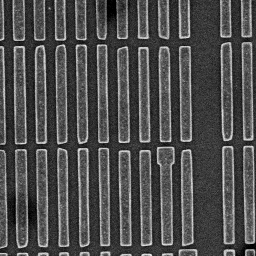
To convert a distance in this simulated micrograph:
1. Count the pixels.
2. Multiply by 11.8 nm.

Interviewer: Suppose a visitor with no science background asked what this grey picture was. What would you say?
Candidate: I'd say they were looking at wiring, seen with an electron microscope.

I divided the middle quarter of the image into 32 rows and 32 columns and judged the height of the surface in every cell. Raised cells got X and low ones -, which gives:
---XX----XX---XX---XX---XX---XX-
---XX----XX---XX---XX---XX---XX-
---XXX---XX---XX---XX---XX---XX-
---XXX---XX---XX---XX---XX---XX-
---XXX---XX---XX---XX---XX---XX-
---XXX---XX---XX---XX---XX---XX-
---XXX---XX---XX---XX---XX---XX-
---XXX---XX---XX---XX---XX---XX-
----XX---XX---XX---XX---XX---XX-
----XX---XX---XX---XX---XX---XXX
----XX---XX---XX---XX---XX---XXX
----XX---XX---XX---XX---XX---XXX
----XX---XX---XX---XX---XX---XXX
----XX---XX---XX---XX---XX---XXX
----XX---XX---XX---XX---XX---XXX
----XX---XX---XX---XX---XX---XXX
----XX---XX---XX---XX---XX---XXX
X---XX---XX---XX---XX---XX---XXX
X---XX---XX---XX---XX---XX---XXX
----X---------------------------
--------------------------------
----XX---XX-------------XXX-----
X---XX---XX---XX---XX---XXX---XX
X---XX---XX---XX---XX---XXX---XX
X---XX---XX---XX---XXX--XXX---XX
X---XX---XX---XX---XXX--XXX---XX
X---XX---XX---XX---XXX--XXX---XX
X---XX---XX---XX---XXX--XXX---XX
X---XX---XX---XX---XXX--XXX---XX
X---XX---XX---XX---XXX--XXX---XX
X---XX---XX---XX---XXX--XXX---XX
X---XX---XX---XX---XXX--XXX---XX